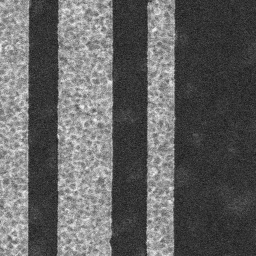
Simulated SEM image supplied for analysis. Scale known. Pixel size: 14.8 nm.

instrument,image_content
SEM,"one or a few lines or trenches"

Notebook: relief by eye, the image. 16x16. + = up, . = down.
++..+++..++.....
++..+++..++.....
++..+++..++.....
++..+++..++.....
++..+++..++.....
++..+++..++.....
++..+++..++.....
++..+++..++.....
++..+++..++.....
++..+++..++.....
++..+++..++.....
++..+++..++.....
++..+++..++.....
++..+++..++.....
++..+++..++.....
++..+++..++.....